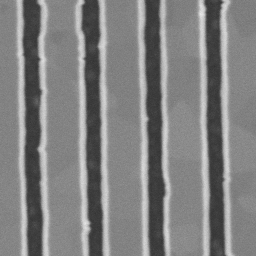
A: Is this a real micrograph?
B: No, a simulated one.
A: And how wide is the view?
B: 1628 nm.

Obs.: parallel lines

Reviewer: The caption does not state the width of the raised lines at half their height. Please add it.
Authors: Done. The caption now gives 267 nm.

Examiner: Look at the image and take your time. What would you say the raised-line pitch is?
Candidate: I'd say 386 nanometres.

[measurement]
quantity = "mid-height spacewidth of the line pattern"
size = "122 nm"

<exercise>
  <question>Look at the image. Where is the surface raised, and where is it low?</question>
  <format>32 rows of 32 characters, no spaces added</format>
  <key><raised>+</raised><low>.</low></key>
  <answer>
+++..+++++...+++++..+++++...++++
+++..+++++...+++++..++++++..++++
+++..+++++...+++++..+++++...++++
+++..+++++...+++++..+++++...++++
+++..+++++...+++++..+++++...++++
+++..+++++...+++++..+++++...++++
+++..+++++...+++++..+++++...++++
+++..+++++...+++++..++++++..++++
+++..+++++...+++++..++++++..++++
+++..+++++...+++++..++++++..++++
+++..+++++...+++++..++++++..++++
+++..+++++...+++++..++++++..++++
+++..+++++...+++++..++++++..++++
+++..+++++...+++++..++++++..++++
+++..+++++...+++++..++++++..++++
+++..+++++...+++++...++++...++++
+++..+++++...+++++..++++++..++++
+++..+++++...+++++..++++++..++++
+++..+++++...+++++..++++++..++++
+++..+++++...+++++..++++++..++++
+++..+++++...+++++..++++++..++++
+++..++++++..+++++...+++++..++++
+++..+++++...+++++...+++++..++++
+++..++++++..+++++...+++++..++++
+++..++++++..+++++...+++++..++++
+++...+++++..+++++...+++++..++++
+++...+++++..+++++...+++++..++++
+++...+++++..+++++...+++++..++++
+++...+++++..+++++...+++++..++++
+++..++++++..+++++...+++++..++++
+++..++++++..+++++...+++++..++++
+++...+++++..+++++...+++++..++++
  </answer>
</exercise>